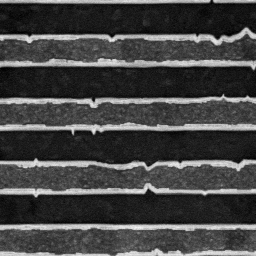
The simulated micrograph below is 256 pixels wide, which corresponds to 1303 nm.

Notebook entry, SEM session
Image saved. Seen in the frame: one or a few lines or trenches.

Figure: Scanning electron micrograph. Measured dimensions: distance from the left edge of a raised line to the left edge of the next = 0.323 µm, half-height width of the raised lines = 143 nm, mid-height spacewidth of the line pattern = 177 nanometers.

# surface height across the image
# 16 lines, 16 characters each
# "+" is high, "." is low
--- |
................
................
++++++++++++++++
++++++++++++++++
................
................
++++++++++++++++
++++++++++++++++
................
................
++++++++++++++++
++++++++++++++++
................
................
++++++++++++++++
++++++++++++++++